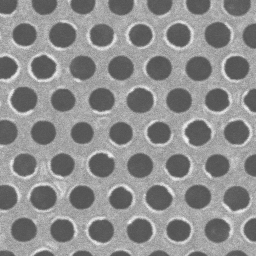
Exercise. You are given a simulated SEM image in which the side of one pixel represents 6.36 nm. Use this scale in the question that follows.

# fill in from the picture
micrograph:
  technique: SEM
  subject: a regular array of holes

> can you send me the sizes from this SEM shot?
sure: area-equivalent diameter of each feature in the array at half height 160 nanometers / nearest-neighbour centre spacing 37.5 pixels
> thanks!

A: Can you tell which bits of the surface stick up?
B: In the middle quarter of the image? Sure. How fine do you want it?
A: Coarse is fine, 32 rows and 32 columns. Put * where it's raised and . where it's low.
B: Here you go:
*.......***......****......***..
**......***......****......***..
**......***......****......****.
**.....*****....******....*****.
********************************
********************************
.******....******....******....*
..*****.....****......****......
...***.......***......****......
...***.......**........***......
..*****.....****......****......
..*****.....*****....******....*
********************************
********************************
****.******************.********
**.....*****.....****.....*****.
**.....****......****......***..
**.....****......****......***..
**.....*****.....****.....*****.
***....*****....******....*****.
********************************
********************************
.*******..********..************
..*****.....****......****.....*
...***.......***......****.....*
...***.......***......***.......
..*****.....****......****.....*
..*****.....****......****.....*
****************************.***
********************************
***...****************...*******
**.....*****....*****.....*****.